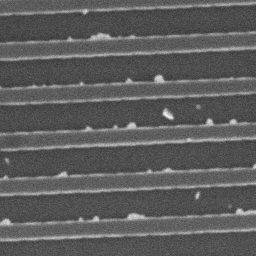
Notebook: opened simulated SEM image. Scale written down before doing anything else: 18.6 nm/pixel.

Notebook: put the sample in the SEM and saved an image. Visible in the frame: lines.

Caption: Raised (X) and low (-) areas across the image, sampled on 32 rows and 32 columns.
XXXXXXXXXXXXXXXXXXXXXXXXXXXXXXXX
XXXXXXXXX-X---------------------
--------------------------------
--------------------------------
---------------------XXXXXXXXXXX
XXXXXXXXXXXXXXXXXXXXXXXXXXXXXXXX
XXXXXXXXXXXXXXXXXXXXXXXX--------
--------------------------------
--------------------------------
--------------------------------
--------------XXXXXXXXXXXXXXXXXX
XXXXXXXXXXXXXXXXXXXXXXXXXXXXXXXX
XXXXXXXXXXXXX-------------------
--------------------------------
--------------------------------
-----------------------------XXX
-------XXXXXXXXXXXXXXXXXXXXXXXXX
XXXXXXXXXXXXXXXXXXXXXXXXXXXX----
XXXXXXX-------------------------
--------------------------------
--------------------------------
-------------------XXXXXXXXXXXXX
XXXXXXXXXXXXXXXXXXXXXXXXXXXXXXXX
XXXXXXXXXXXXXXXXXXXXXX----------
--------------------------------
--------------------------------
--------------------------------
------------XXXXXXXXXXXXXXXXXXXX
XXXXXXXXXXXXXXXXXXXXXXXXXXXXXXXX
XXXXXXXXXXXXXXXX----------------
--------------------------------
--------------------------------